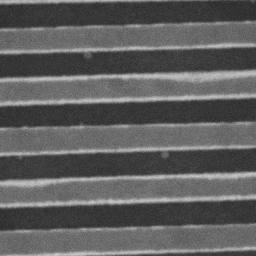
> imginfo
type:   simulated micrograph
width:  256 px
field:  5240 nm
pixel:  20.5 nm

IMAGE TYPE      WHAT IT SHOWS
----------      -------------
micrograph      lines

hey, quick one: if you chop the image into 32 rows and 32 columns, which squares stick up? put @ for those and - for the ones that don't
--------------------------------
--------------------------------
--------------------------------
-------@@@@@@@@@@@@@@@@@@@@@@@@@
@@@@@@@@@@@@@@@@@@@@@@@@@@@@@@@@
@@@@@@@@@@@@@@@@@@@@@@@@@@@@@@@@
@@@@@@--------------------------
--------------------------------
--------------------------------
------------@@@@@@@@@@@@@@@@@@@@
@@@@@@@@@@@@@@@@@@@@@@@@@@@@@@@@
@@@@@@@@@@@@@@@@@@@@@@@@@@@@@@@@
@@@@@@@@@@@@@@@@@@@@@@----------
--------------------------------
--------------------------------
------------------------@@@@@@@@
@@@@@@@@@@@@@@@@@@@@@@@@@@@@@@@@
@@@@@@@@@@@@@@@@@@@@@@@@@@@@@@@@
@@@@@@@@@@@@@@@@@@@@@@@@@@@@@@@-
--------------------------------
--------------------------------
--------------------------------
------@@@@@@@@@@@@@@@@@@@@@@@@@@
@@@@@@@@@@@@@@@@@@@@@@@@@@@@@@@@
@@@@@@@@@@@@@@@@@@@@@@@@@@@@@@@@
@@@@@@@@@@@@@-------------------
--------------------------------
--------------------------------
---------------@@@@@@@@@@@@@@@@@
@@@@@@@@@@@@@@@@@@@@@@@@@@@@@@@@
@@@@@@@@@@@@@@@@@@@@@@@@@@@@@@@@
@@@@@@@@@@@@@@@@@@@@@@@---------